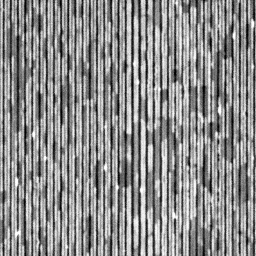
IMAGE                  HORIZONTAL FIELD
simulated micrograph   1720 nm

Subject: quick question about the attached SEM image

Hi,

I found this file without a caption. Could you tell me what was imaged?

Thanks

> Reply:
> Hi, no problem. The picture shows parallel lines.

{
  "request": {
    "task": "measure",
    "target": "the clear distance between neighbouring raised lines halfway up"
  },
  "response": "18.5 nm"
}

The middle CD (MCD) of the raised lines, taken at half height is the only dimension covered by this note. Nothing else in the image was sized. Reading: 30.3 nanometers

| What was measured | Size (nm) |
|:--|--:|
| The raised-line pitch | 48.2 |